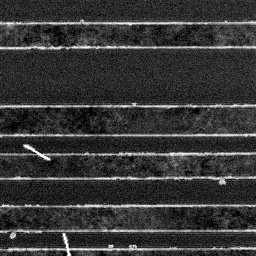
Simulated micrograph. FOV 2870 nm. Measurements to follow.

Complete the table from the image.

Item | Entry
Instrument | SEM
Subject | lines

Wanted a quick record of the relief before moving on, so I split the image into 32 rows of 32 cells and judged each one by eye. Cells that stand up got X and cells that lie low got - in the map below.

--------------------------------
--------------------------------
--------------------------------
XXXXXXXXXXXXXXXXXXXXXXXXXXXXXXXX
XXXXXXXXXXXXXXXXXXXXXXXXXXXXXXXX
XXXXXXXXXXXXXXXXXXXXXXXXXXXXXXXX
--------------------------------
--------------------------------
--------------------------------
--------------------------------
--------------------------------
--------------------------------
--------------------------------
XXXXXXXXXXXXXXXXXXXXXXXXXXXXXXXX
XXXXXXXXXXXXXXXXXXXXXXXXXXXXXXXX
XXXXXXXXXXXXXXXXXXXXXXXXXXXXXXXX
XXXXXXXXXXXXXXXXXXXXXXXXXXXXXXXX
--------------------------------
--------------------------------
XXXXXXXXXXXXXXXXXXXXXXXXXXXXXXXX
XXXXXXXXXXXXXXXXXXXXXXXXXXXXXXXX
XXXXXXXXXXXXXXXXXXXXXXXXXXXXXXXX
---------------------------X----
--------------------------------
--------------------------------
--------------------------------
XXXXXXXXXXXXXXXXXXXXXXXXXXXXXXXX
XXXXXXXXXXXXXXXXXXXXXXXXXXXXXXXX
XXXXXXXXXXXXXXXXXXXXXXXXXXXXXXXX
--------------------------------
--------------------------------
XXXXXXXXXXXXXXXXXXXXXXXXXXXXXXXX